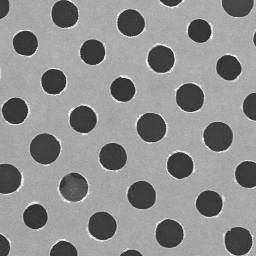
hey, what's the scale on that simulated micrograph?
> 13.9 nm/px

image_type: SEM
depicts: a regular array of holes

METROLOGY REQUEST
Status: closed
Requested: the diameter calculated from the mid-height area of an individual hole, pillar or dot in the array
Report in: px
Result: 27.1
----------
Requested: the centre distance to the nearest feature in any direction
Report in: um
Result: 0.662